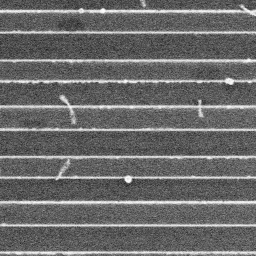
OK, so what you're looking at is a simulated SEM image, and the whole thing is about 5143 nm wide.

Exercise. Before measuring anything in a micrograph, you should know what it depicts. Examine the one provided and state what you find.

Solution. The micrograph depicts lines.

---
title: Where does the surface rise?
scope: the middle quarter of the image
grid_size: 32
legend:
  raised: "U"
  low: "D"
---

UUUUUUUUUUUUUUUUUUUUUUUUUUUUUUUU
UUUUUUUUUUUUUUUUUUUUUUUUUUUUUUUU
UUUUUUUUUUUUUUUUUUUUUUUUUUUUUUUU
UUUUUUUUUUUUUUUUUUUUUUUUUUUUUUUU
UDDDDDDDDUDDDUUUDUDDDDDDDDDDDDDD
DDDDDDDDDDDDDDDDDDDDDDDDDDDDDDDD
DDDDDDDDDDDDDDDDDDDDDDDDDDDDDDDD
DDDDDDDDDDDDDDDDDDDDDDDDDDDDDDDD
DDDDDDDDDDDDDDDDDDDDDDDDDDDDDDDD
DDDDDDDDDDDDDDDDDDDDDDDDDDDDDDDD
DUDDDDDDDDDDDDDDDDDDDDDDDDDDDDDD
UUUUUUUUUUUUUUUUUUUUUUUUUUUUUUUU
UUUUUUUUUUUUUUUUUUUUUUUUUUUUUUUU
UUUUUUUUUUUUUUUUUUUUUUUUUUUUUUUU
UUUUUUUUUUUUUUUUUUUUUUUUUUUUUUUU
UUUUUUUUUUUUUUUUUUUUUUUUUUUUUUUU
DDDDDDDDDDDDDDDDDDDDDDDDDDDDDDDD
DDDDDDDDDDDDDDDDDDDDDDDDDDDDDDDD
DDDDDDDDDDDDDDDDDDDDDDDDDDDDDDDD
DDDDDDDDDDDDDDDDDDDDDDDDDDDDDDDD
DDDDDDDDDDDDDDDDDDDDDDDDDDDDDDDD
DDDDDDDDDDDDDDDDDDDDDDDDDDDDDDDD
DDDDDDDDDDDDDDDDDDDDDDDDDDDDDDDD
UUUUUUUUUUUUUUUUUUUUUUUUUUUUUUUU
UUUUUUUUUUUUUUUUUUUUUUUUUUUUUUUU
UUUUUUUUUUUUUUUUUUUUUUUUUUUUUUUU
UUUUUUUUUUUUUUUUUUUUUUUUUUUUUUUU
UUUUUUUUUUUUUUUUUUUUUUUUUUUUUUUU
DDDDDDDDDDDDDDDUUDDDDDDDDDDDDDDD
DDDDDDDDDDDDDDDDDDDDDDDDDDDDDDDD
DDDDDDDDDDDDDDDDDDDDDDDDDDDDDDDD
DDDDDDDDDDDDDDDDDDDDDDDDDDDDDDDD